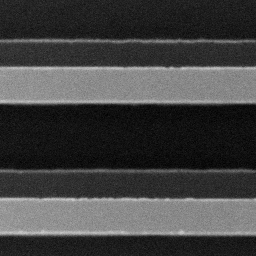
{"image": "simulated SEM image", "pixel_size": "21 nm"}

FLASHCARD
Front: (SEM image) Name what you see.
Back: lines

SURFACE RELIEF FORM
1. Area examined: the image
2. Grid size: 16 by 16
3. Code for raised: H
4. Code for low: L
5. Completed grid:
LLLLLLLLLLLLLLLL
LLLLLLLLLLLLLLLL
LLLLLLLLLLLLLLLL
HHHHHHHHHHHHHHHH
HHHHHHHHHHHHHHHH
HHHHHHHHHHHHHHHH
LLLLLLLLLLLLLLLL
LLLLLLLLLLLLLLLL
LLLLLLLLLLLLLLLL
LLLLLLLLLLLLLLLL
LLLLLLLLLLLLLLLL
HHHHHHHHHHHHHHHH
HHHHHHHHHHHHHHHH
HHHHHHHHHHHHHHHH
HHHHHHHHHHHHHHHH
LLLLLLLLLLLLLLLL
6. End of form